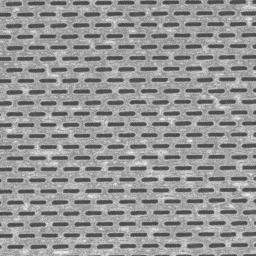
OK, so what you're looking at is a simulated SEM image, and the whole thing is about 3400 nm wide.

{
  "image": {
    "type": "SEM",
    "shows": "a regular array of holes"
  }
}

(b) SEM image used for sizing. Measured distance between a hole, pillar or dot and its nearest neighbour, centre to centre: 206 nanometers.